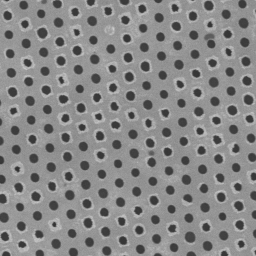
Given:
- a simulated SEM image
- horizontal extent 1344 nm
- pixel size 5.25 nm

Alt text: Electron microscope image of a regular array of holes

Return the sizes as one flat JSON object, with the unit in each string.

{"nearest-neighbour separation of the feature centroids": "0.0997 um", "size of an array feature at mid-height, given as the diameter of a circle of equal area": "0.0448 micrometres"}